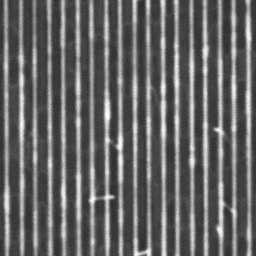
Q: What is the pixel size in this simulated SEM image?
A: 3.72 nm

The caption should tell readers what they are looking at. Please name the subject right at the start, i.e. parallel lines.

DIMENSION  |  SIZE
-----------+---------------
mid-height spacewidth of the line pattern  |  43.3 nm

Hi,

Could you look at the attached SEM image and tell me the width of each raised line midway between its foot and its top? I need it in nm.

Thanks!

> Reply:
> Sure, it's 10.2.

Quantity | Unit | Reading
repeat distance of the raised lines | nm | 53.1